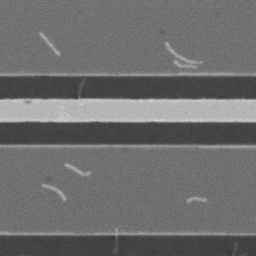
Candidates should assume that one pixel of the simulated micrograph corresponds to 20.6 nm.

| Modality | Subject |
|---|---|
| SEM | lines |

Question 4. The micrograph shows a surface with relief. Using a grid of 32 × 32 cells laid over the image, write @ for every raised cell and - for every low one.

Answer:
@@@@@@@@@@@@@@@@@@@@@@@@@@@@@@@@
@@@@@@@@@@@@@@@@@@@@@@@@@@@@@@@@
@@@@@@@@@@@@@@@@@@@@@@@@@@@@@@@@
@@@@@@@@@@@@@@@@@@@@@@@@@@@@@@@@
@@@@@@@@@@@@@@@@@@@@@@@@@@@@@@@@
@@@@@@@@@@@@@@@@@@@@@@@@@@@@@@@@
@@@@@@@@@@@@@@@@@@@@@@@@@@@@@@@@
@@@@@@@@@@@@@@@@@@@@@@@@@@@@@@@@
@@@@@@@@@@@@@@@@@@@@@@@@@@@@@@@@
--------------------------------
--------------------------------
--------------------------------
-@@@@@@@@@@@@@@@@-@@@-@@-@@--@--
@@@@@@@@@@@@@@@@@@@@@@@@@@@@@@@@
@@@@@@@@@@@@@@@@@@@@@@@@@@@@@@@@
--------------------------------
--------------------------------
--------------------------------
@@@@@@@@@@@@@@@@@@@@@@@@@@@@@@@@
@@@@@@@@@@@@@@@@@@@@@@@@@@@@@@@@
@@@@@@@@@@@@@@@@@@@@@@@@@@@@@@@@
@@@@@@@@@@@@@@@@@@@@@@@@@@@@@@@@
@@@@@@@@@@@@@@@@@@@@@@@@@@@@@@@@
@@@@@@@@@@@@@@@@@@@@@@@@@@@@@@@@
@@@@@@@@@@@@@@@@@@@@@@@@@@@@@@@@
@@@@@@@@@@@@@@@@@@@@@@@@@@@@@@@@
@@@@@@@@@@@@@@@@@@@@@@@@@@@@@@@@
@@@@@@@@@@@@@@@@@@@@@@@@@@@@@@@@
@@@@@@@@@@@@@@@@@@@@@@@@@@@@@@@@
--------------------------------
--------------------------------
--------------------------------